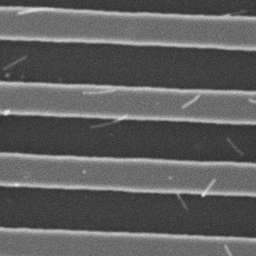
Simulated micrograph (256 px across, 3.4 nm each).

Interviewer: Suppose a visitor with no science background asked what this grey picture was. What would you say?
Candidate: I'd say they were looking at lines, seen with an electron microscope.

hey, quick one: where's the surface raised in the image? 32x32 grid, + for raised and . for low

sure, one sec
................................
+++++++++++++++.................
++++++++++++++++++++++++++++++++
++++++++++++++++++++++++++++++++
++++++++++++++++++++++++++++++++
...............+++++++++++++++++
................................
................................
................................
................................
++++++..........................
++++++++++++++++++++++++++++++++
++++++++++++++++++++++++++++++++
++++++++++++++++++++++++++++++++
.......+++++++++++++++++++++++++
..............................++
................................
................................
................................
++++++..........................
++++++++++++++++++++++++++++++++
++++++++++++++++++++++++++++++++
++++++++++++++++++++++++++++++++
........++++++++++++++++++++++++
...............................+
................................
................................
................................
+...............................
++++++++++++++++++++++++++......
++++++++++++++++++++++++++++++++
++++++++++++++++++++++++++++++++